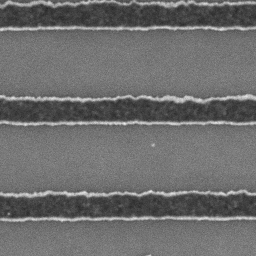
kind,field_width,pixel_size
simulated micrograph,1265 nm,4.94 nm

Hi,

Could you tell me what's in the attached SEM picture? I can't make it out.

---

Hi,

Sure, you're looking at lines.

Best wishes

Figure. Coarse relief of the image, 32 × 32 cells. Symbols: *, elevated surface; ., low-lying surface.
.*******************************
********************************
********************************
*******.*.*********..****.***.**
................................
................................
................................
................................
................................
................................
................................
................................
*************************.******
********************************
********************************
..***.*........*.............**.
................................
................................
................................
................................
................................
................................
................................
................................
********************************
********************************
********************************
.*..............................
................................
................................
................................
................................